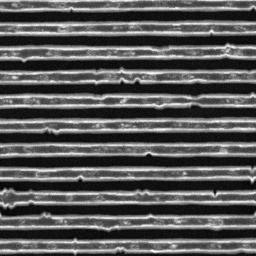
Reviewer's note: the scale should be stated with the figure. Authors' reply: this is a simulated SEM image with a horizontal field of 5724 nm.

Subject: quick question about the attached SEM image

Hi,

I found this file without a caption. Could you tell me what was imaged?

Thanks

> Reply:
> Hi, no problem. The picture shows parallel lines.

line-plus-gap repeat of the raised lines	541	nm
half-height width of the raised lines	11.6	px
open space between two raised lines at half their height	282	nanometers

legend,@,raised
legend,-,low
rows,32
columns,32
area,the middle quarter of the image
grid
--------------------------------
--------------@-----------------
@@@@@@@@@@@@@@@@@@@@@@@@@@@@@@@@
@@@@@@@@@@@@@@@@@@@@@@@@@@@@@@@@
@@@@---@@@------@@-@@@--@@@@@@@@
--------------------------------
--------------------------------
--------------------------------
@@@@@@@@@@@@@@@@@@@@@@@@@@@@@@@@
@@@@@@@@@@@@@@@@@@@@@@@@@@@@@@@@
@@@@------------------@@@-------
--------------------------------
--------------------------------
--------------------------------
@@@@@@@@@@@@@@@@@@@@@@@@@@@@@@@@
@@@@@@@@@@@@@@@@@@@@@@@@@@@@@@@@
@@@@@@@@@@@@@@@@@@@@@@@@@@------
--------------------------------
--------------------------------
--------------------------------
@@@@@@@@@@@@@@@@@@@@@@@@@@@@@@@@
@@@@@@@@@@@@@@@@@@@@@@@@@@@@@@@@
@@@@@@@@@@@@@@@@@@@@@@@@@@@@@@@@
--------------------------------
--------------------------------
--------------------------------
@@@@@@@@@@@@@@@@@@@@@@@@@@@@@@@@
@@@@@@@@@@@@@@@@@@@@@@@@@@@@@@@@
@@@@@@@@@@@@@@@@@@@@@@@@@@@@@@@@
--------------------------------
--------------------------------
--------------------------------